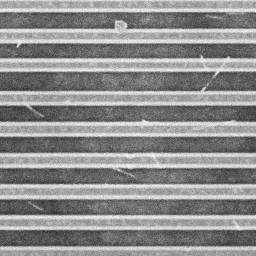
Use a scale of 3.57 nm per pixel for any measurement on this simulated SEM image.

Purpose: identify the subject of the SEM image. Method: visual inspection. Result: parallel lines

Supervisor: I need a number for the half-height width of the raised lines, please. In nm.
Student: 39.8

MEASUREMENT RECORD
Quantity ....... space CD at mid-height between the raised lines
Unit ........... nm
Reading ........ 69.7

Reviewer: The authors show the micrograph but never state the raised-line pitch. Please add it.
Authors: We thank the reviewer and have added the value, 0.111 um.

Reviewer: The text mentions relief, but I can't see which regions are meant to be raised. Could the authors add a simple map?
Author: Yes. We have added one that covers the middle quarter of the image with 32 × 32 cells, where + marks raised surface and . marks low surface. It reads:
++++++++++++++++++++++++++++++++
................................
................................
................................
................................
................................
................................
++++++++++++++++++++++++++++++++
++++++++++++++++++++++++++++++++
++++++++++++++++++++++++++++++++
................................
................................
................................
................................
................................
++++++++++++++++++++++++++++++++
++++++++++++++++++++++++++++++++
++++++++++++++++++++++++++++++++
................................
................................
................................
................................
................................
++++++++++++++++++++++++++++++++
++++++++++++++++++++++++++++++++
++++++++++++++++++++++++++++++++
................................
................................
................................
................................
..........+.....................
++++++++++++++++++++++++++++++++